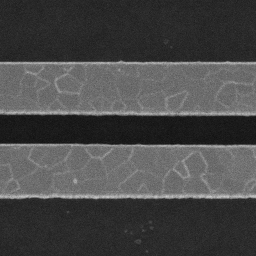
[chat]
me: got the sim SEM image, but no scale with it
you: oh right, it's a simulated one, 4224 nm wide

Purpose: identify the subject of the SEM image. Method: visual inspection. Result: lines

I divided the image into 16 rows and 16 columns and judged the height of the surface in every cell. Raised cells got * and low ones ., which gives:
................
................
................
................
****************
****************
****************
................
................
****************
****************
****************
................
................
................
................